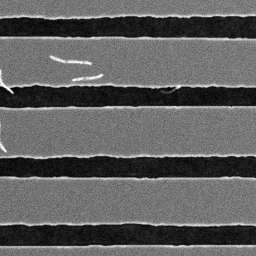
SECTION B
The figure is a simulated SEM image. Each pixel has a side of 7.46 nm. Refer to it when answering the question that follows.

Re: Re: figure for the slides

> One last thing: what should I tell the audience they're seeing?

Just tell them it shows lines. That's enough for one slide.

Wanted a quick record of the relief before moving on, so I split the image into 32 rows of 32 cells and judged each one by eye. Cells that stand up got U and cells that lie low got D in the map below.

UUUUUUUUUUUUUUUUUUUUUUUUUUUUUUUU
UUUUUUUUUUUUUUUUUUUUUUUUUUUUUUUU
DDDDDDDDDDDDDDDDDDDDDDDDDDDDDDDD
DDDDDDDDDDDDDDDDDDDDDDDDDDDDDDDD
DDDDDDDDDDDDDDDDDDDDDDDDDDDDDDDD
UUUUUUUUUUUUUUUUUUUUUUUUUUUUUUUU
UUUUUUUUUUUUUUUUUUUUUUUUUUUUUUUU
UUUUUUUUUUUUUUUUUUUUUUUUUUUUUUUU
UUUUUUUUUUUUUUUUUUUUUUUUUUUUUUUU
UUUUUUUUUUUUUUUUUUUUUUUUUUUUUUUU
UUUUUUUUUUUUUUUUUUUUUUUUUUUUUUUU
DDDDDDDDDDDDDDDDDDDDDDDDDDDDDDDD
DDDDDDDDDDDDDDDDDDDDDDDDDDDDDDDD
UUDUUUUUUUUUUUUUUUUUUUUUUUUUUUUU
UUUUUUUUUUUUUUUUUUUUUUUUUUUUUUUU
UUUUUUUUUUUUUUUUUUUUUUUUUUUUUUUU
UUUUUUUUUUUUUUUUUUUUUUUUUUUUUUUU
UUUUUUUUUUUUUUUUUUUUUUUUUUUUUUUU
UUUUUUUUUUUUUUUUUUUUUUUUUUUUUUUU
UUUUUUUUUUUUDUUUUUUUUUUUUUUUUUUU
DDDDDDDDDDDDDDDDDDDDDDDDDDDDDDDD
DDDDDDDDDDDDDDDDDDDDDDDDDDDDDDDD
UUUUUUUUUUUUUUUUUUUUUUUUUUUUUUUU
UUUUUUUUUUUUUUUUUUUUUUUUUUUUUUUU
UUUUUUUUUUUUUUUUUUUUUUUUUUUUUUUU
UUUUUUUUUUUUUUUUUUUUUUUUUUUUUUUU
UUUUUUUUUUUUUUUUUUUUUUUUUUUUUUUU
UUUUUUUUUUUUUUUUUUUUUUUUUUUUUUUU
DDDDDDDDDDDDDDDDDDDDDDDDDDDDDDDD
DDDDDDDDDDDDDDDDDDDDDDDDDDDDDDDD
DDDDDDDDDDDDDDDDDDDDDDDDDDDDDDDD
UUUUUUUUUUUUUUUUUUUUUUUUUUUUUUUU